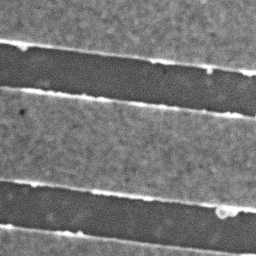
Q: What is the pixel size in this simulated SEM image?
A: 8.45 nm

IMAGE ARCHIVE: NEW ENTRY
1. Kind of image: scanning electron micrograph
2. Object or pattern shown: one or a few lines or trenches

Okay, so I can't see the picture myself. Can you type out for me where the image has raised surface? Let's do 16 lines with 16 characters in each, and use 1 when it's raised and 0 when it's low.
1111111111111111
1111111111111111
1111111111111111
0000000011111111
0000000000000001
1000000000000000
1111111110000000
1111111111111111
1111111111111111
1111111111111111
1111111111111111
0011111111111111
0000000000111111
0000000000000000
1111000000000000
1111111111100000